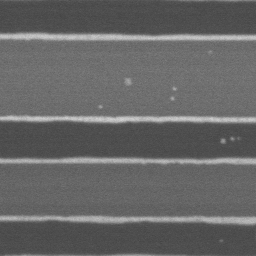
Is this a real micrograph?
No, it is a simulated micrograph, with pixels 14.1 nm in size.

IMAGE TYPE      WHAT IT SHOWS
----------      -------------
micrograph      lines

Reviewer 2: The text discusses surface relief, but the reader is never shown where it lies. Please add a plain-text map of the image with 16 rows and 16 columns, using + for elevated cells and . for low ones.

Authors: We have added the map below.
++++++++++++++++
++++++++++++++++
................
................
................
................
................
++++++++++++++++
++++++++++++++++
++++++++++++++++
................
................
................
................
++++++++++++++++
++++++++++++++++